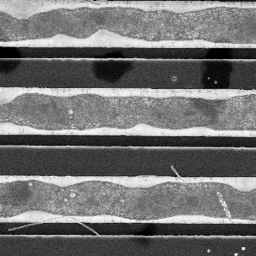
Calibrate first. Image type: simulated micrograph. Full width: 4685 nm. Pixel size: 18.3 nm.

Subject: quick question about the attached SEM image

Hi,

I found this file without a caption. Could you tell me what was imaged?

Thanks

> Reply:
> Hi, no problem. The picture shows lines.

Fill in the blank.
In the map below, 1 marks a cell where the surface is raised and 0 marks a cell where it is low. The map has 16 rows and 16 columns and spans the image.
1111111111111111
1111111111111111
1111111111111111
0000000000000000
0000000000000000
0000000000000000
1111111111111111
1111111111111111
0000000000000000
0000000000000000
0000000000000000
1111111111111111
1111111111111111
1111111111111111
0000000000000000
0000000000000000